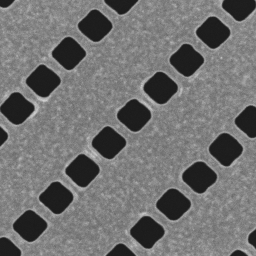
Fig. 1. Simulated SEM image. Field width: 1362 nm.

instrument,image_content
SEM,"a regular array of holes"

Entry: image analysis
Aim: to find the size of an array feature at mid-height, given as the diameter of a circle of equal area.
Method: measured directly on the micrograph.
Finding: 163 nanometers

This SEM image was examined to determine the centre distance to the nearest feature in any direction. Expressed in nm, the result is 200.